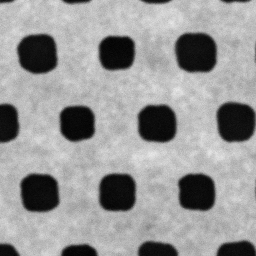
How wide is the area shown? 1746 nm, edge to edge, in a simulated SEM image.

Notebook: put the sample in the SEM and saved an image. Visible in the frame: a regular array of holes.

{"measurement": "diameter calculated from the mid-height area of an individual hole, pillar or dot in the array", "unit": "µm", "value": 0.273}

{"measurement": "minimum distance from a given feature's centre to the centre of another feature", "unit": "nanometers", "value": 538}